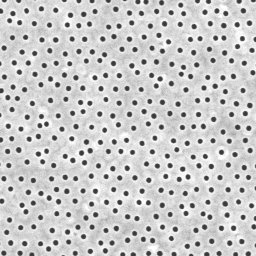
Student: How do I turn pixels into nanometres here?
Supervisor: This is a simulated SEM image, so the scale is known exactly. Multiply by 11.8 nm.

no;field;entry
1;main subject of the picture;a regular array of holes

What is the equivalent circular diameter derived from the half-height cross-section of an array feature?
62.2 nm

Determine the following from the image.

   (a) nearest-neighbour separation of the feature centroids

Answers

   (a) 0.137 micrometres